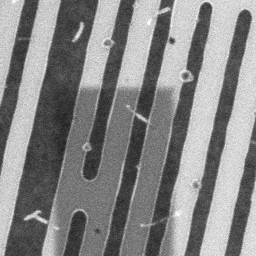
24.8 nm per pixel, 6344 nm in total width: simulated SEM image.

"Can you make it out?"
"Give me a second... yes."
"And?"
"groups of lines, slits or small figures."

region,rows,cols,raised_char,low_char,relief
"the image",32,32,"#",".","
...##..#####...##...##...#......
...##..#####...##...##...##...#.
..##...#####..###..##....#...###
..##...#####..##...##...##...##.
..##...####...##...##...##...##.
..##..#####..###...##...##...##.
.###..#####...##...##..###...##.
.##...#####..##...##...##...##..
.##...#####..##...##...##...##..
.##..#####...##...##...##...##..
.##..#####...##...##...##...##..
##...#####..###..##...##...###..
##...#####..##...##...##...##...
##..#####...##...##...##...##...
##..#####...##...##...##...##...
##..#####...##..###..###...##...
#...#####..##...##...##...##...#
#...#####..##...##...##...##...#
#..#####...##...##...##...##...#
#..#####...##...##...##...##...#
...#####..###..###..###...##..##
...#####..##...##...##...##...##
..#####....#...##...##...##...##
..#####........##...##..###...##
..#####........##...##...##...##
..#####.......##...##...###..##.
..#####..#....##...##...##...##.
.#####...##...##...##...##...##.
.#####...##...##...##...##...##.
.#####..###..##...###..###...##.
.#####..##...##...##...##...##..
.####...##...##...##...##...##..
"